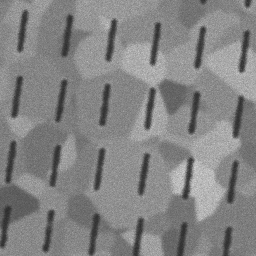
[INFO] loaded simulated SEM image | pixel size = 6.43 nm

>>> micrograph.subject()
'a regular array of holes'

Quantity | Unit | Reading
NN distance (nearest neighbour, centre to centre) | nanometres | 285